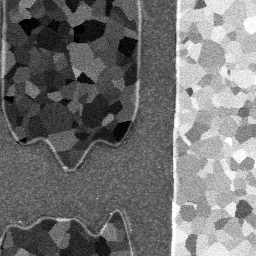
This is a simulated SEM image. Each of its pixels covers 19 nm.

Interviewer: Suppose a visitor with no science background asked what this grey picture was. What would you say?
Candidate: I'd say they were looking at one or a few lines or trenches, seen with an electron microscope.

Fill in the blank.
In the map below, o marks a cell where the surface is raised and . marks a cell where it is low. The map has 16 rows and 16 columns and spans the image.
ooooooooo..ooooo
ooooooooo..ooooo
ooooooooo..ooooo
ooooooooo..ooooo
ooooooooo..ooooo
ooooooooo..ooooo
ooooooooo..ooooo
oooooooo...ooooo
.ooooooo...ooooo
...oo......ooooo
....o......ooooo
...........ooooo
...........ooooo
.......o...ooooo
oooooooo...ooooo
oooooooo...ooooo